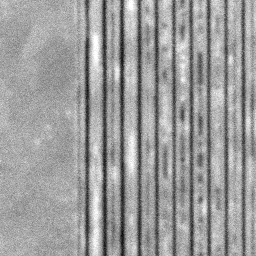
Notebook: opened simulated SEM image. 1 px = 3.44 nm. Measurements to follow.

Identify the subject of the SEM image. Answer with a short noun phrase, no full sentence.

parallel lines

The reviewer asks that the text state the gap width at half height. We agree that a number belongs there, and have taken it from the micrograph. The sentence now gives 10.3 nanometers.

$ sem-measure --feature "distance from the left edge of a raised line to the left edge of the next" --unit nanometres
30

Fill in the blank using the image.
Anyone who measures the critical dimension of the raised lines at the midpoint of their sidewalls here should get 23.2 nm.